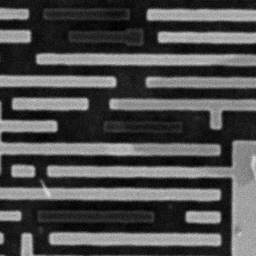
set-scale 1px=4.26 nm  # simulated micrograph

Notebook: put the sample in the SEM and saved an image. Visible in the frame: wiring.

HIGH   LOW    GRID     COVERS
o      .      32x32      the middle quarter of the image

................................
................................
................................
oooooooooooo...................o
ooooooooooooo........ooooooooooo
ooooooooooooo........ooooooooooo
................................
................................
................................
oooooo......oooooooooooooooooooo
oooooo......oooooooooooooooooooo
................................
................................
................................
..........oooooooooooo..........
..........ooooooooooooooooooo...
..........ooooooooooooooooooo...
................................
................................
................................
oooooooooooooooooooooooooooooooo
oooooooooooooooooooooooooooooooo
oooooooooooooooooooooooooooooooo
................................
................................
................................
oooooooooooooooooooooooooooooooo
oooooooooooooooooooooooooooooooo
................................
................................
................................
oooooooooooooooooooooooooooooooo